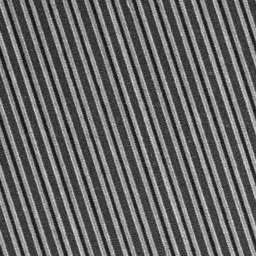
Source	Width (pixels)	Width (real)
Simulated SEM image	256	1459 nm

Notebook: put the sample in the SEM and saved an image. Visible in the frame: parallel lines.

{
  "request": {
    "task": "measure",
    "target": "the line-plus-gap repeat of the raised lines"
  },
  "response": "58 nanometres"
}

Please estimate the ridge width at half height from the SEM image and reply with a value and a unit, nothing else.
21.7 nanometres